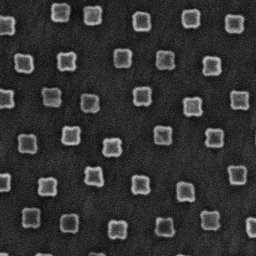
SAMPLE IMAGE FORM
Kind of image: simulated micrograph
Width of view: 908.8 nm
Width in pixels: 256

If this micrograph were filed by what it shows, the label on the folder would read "a regular array of raised bodies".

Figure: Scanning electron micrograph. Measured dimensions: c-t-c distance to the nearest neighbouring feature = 0.142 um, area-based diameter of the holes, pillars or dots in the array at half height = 0.0697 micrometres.